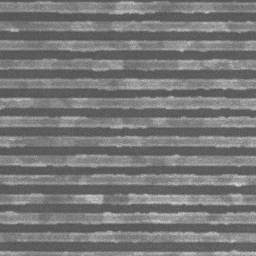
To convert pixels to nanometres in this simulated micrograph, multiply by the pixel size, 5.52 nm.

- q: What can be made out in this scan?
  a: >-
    parallel lines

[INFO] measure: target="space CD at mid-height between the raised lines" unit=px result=9.75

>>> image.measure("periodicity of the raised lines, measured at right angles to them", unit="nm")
106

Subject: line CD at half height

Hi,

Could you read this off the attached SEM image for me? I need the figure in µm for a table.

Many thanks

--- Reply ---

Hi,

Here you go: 0.0538